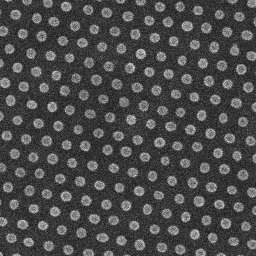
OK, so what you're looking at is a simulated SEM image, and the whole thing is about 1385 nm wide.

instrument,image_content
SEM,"a regular array of raised bodies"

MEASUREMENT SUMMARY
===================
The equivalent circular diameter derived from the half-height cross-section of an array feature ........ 50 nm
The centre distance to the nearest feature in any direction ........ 101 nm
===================